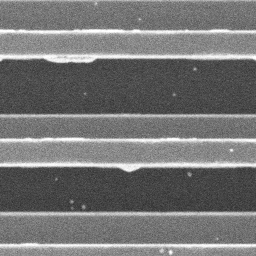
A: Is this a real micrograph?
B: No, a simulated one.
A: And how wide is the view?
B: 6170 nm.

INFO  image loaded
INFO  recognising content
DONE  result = lines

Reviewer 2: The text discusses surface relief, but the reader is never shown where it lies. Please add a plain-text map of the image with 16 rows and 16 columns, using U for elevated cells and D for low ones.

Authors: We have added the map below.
UUUUUUUUUUUUUUUU
UUUUUUUUUUUUUUUU
UUUUUUUUUUUUUUUU
UUUUUUUUUUUUUUUU
DDDDDDDDDDDDDDDD
DDDDDDDDDDDDDDDD
DDDDDDDDDDDDDDDD
UUUUUUUUUUUUUUUU
UUUUUUUUUUUUUUUU
UUUUUUUUUUUUUUUU
DDDDDDDUUDDDDDDD
DDDDDDDDDDDDDDDD
DDDDDDDDDDDDDDDD
UUUUUUUUUUUUUUUU
UUUUUUUUUUUUUUUU
UUUUUUUUUUUUUUUU